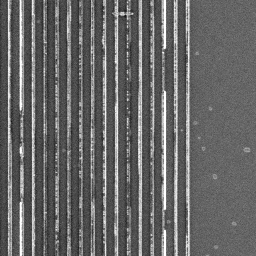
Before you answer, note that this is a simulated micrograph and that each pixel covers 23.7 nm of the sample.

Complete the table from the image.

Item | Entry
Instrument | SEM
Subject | parallel lines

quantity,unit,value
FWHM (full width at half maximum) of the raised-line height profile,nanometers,65.1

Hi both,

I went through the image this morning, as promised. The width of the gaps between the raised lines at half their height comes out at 0.216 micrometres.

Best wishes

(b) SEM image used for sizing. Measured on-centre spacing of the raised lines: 280 nanometres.